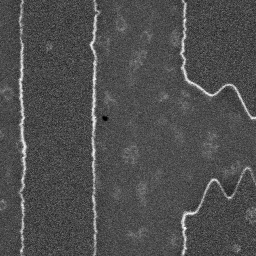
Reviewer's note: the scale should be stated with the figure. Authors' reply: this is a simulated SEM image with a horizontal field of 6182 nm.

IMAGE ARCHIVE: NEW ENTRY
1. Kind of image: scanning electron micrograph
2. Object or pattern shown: one or a few lines or trenches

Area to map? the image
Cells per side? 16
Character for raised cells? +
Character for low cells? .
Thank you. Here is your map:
.+++++......++++
.+++++......++++
.+++++.....+++++
.+++++.....+++++
.+++++......++++
.+++++......++.+
.+++++.........+
.+++++..........
.+++++..........
..++++..........
..++++..........
.+++++.......+.+
.+++++.......+++
.+++++......++++
.+++++......++++
.+++++......++++